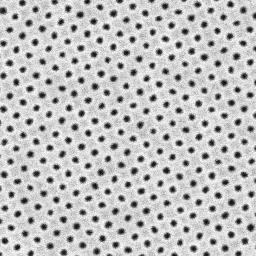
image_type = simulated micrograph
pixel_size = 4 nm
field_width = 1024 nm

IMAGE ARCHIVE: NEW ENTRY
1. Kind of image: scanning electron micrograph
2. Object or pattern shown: a regular array of holes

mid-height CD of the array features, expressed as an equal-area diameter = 28.5 nm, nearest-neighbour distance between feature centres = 56.4 nanometers